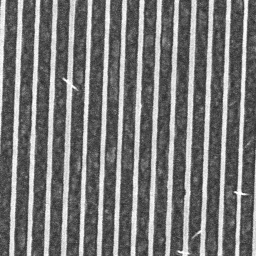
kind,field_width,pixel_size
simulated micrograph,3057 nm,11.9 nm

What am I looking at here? parallel lines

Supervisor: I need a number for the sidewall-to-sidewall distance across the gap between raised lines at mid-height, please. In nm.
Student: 155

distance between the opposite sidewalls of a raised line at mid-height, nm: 50.7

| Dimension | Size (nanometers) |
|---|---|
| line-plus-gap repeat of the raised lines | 207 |